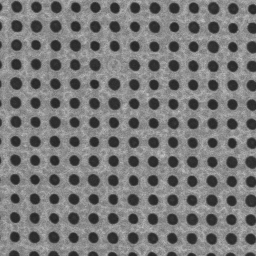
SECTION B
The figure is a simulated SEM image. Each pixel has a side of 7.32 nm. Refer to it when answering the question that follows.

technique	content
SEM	a regular array of holes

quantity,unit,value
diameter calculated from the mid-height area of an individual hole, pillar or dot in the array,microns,0.0766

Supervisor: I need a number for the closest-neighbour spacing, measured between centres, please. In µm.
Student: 0.139